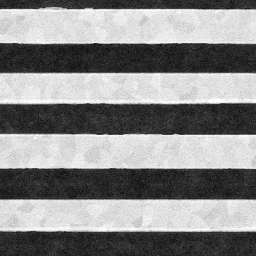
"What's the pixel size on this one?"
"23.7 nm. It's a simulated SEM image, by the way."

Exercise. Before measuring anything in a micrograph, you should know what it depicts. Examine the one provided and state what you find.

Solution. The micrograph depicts lines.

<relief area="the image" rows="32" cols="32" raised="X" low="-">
--------------------------------
XXXXXXXXXXXXXXXXXXXXXXXXXXXXXXXX
XXXXXXXXXXXXXXXXXXXXXXXXXXXXXXXX
XXXXXXXXXXXXXXXXXXXXXXXXXXXXXXXX
XXXXXXXXXXXXXXXXXXXXXXXXXXXXXXXX
--------------------------------
--------------------------------
--------------------------------
--------------------------------
XXXXXXXXXXXXXXXXXXXXXXXXXXXXXXXX
XXXXXXXXXXXXXXXXXXXXXXXXXXXXXXXX
XXXXXXXXXXXXXXXXXXXXXXXXXXXXXXXX
XXXXXXXXXXXXXXXXXXXXXXXXXXXXXXXX
--------------------------------
--------------------------------
--------------------------------
--------------------------------
XXXXXXXXXXXXXXXXXXXXXXXXXXXXXXXX
XXXXXXXXXXXXXXXXXXXXXXXXXXXXXXXX
XXXXXXXXXXXXXXXXXXXXXXXXXXXXXXXX
XXXXXXXXXXXXXXXXXXXXXXXXXXXXXXXX
--------------------------------
--------------------------------
--------------------------------
--------------------------------
XXXXXXXXXXXXXXXXXXXXXXXXXXXXXXXX
XXXXXXXXXXXXXXXXXXXXXXXXXXXXXXXX
XXXXXXXXXXXXXXXXXXXXXXXXXXXXXXXX
XXXXXXXXXXXXXXXXXXXXXXXXXXXXXXXX
--------------------------------
--------------------------------
--------------------------------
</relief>